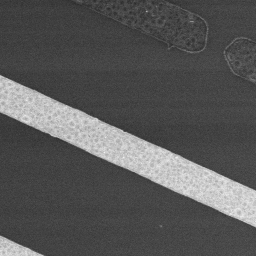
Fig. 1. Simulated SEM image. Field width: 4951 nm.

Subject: one or a few lines or trenches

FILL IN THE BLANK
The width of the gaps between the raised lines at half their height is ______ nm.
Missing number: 1890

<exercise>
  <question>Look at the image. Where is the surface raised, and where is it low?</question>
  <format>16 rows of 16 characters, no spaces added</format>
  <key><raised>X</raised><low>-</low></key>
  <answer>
------XXXXX-----
--------XXXXX---
----------XXX--X
--------------XX
---------------X
XX--------------
XXXX------------
-XXXXX----------
---XXXXX--------
------XXXXX-----
--------XXXXX---
----------XXXXX-
------------XXXX
--------------XX
----------------
XX--------------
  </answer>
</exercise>